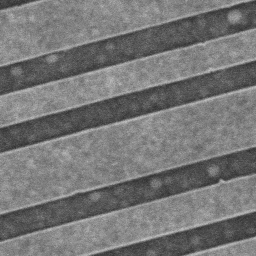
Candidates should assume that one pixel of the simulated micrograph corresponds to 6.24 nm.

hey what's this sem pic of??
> one or a few lines or trenches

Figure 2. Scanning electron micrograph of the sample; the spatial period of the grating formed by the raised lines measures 443 nanometers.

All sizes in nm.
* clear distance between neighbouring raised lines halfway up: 172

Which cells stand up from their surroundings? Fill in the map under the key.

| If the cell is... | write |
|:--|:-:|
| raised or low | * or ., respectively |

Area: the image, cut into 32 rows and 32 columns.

...***************************..
*************************.......
**********************..........
******************..............
**************...............***
**********...............*******
*******..............***********
***..............**************.
.............***************....
..........**************........
......**************............
..**************.............***
*************.............******
*********.............**********
*****.............**************
*.............******************
..........**********************
......**************************
...****************************.
***************************.....
***********************.........
********************............
****************.............***
************..............******
********..............**********
****..............**************
*.............*****************.
..........******************....
.......*****************........
...*****************............
****************.............***
************.............*******